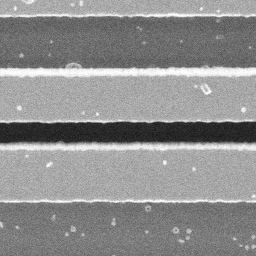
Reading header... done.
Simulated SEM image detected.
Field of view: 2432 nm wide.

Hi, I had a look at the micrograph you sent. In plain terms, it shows lines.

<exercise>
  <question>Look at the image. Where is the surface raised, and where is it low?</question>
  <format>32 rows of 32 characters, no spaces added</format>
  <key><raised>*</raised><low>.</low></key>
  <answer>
********************************
********************************
................................
................................
................................
................................
................................
................................
................................
********************************
********************************
********************************
********************************
********************************
********************************
................................
................................
................................
********************************
********************************
********************************
********************************
********************************
********************************
********************************
................................
................................
................................
................................
................................
................................
................................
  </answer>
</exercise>